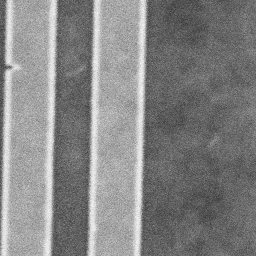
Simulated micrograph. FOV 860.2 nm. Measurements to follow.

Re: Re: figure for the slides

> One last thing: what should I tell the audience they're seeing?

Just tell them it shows one or a few lines or trenches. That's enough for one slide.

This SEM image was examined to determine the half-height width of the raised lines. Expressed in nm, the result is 150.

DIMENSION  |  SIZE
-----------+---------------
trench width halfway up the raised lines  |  43.6 pixels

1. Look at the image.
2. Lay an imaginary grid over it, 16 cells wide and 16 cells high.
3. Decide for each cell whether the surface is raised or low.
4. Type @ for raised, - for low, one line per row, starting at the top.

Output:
-@@---@@@-------
-@@---@@@-------
-@@---@@@-------
-@@---@@@-------
-@@---@@@-------
@@@---@@@-------
@@@---@@@-------
@@@---@@@-------
@@@---@@@-------
@@@---@@@-------
@@@---@@@-------
@@@---@@@-------
@@@---@@@-------
@@@---@@@-------
@@@---@@@-------
@@@---@@@-------